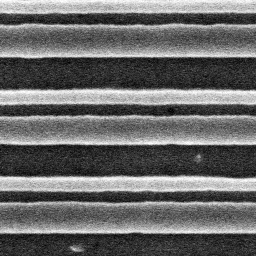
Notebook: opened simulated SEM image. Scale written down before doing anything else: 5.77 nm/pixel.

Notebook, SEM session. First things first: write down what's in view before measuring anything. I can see lines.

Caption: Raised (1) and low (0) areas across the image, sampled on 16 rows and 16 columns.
1111111111111111
1111111111111111
1111111111111111
1111111111111111
0000000000000000
0000000000000000
1111111111111111
1111111111111111
1111111111111111
0000000000000000
0000000000000000
1111111111111111
1111111111111111
1111111111111111
1111111111111111
0000000000000000